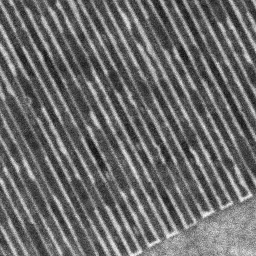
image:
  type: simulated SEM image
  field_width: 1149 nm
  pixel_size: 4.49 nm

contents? parallel lines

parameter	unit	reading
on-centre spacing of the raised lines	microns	0.0919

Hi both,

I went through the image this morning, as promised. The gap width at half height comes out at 35.9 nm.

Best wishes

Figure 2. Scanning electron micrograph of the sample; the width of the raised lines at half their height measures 55.3 nanometres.